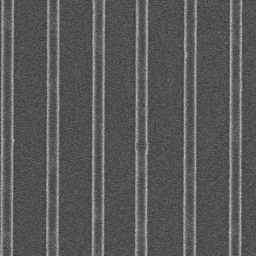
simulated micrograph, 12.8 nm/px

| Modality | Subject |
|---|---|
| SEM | parallel lines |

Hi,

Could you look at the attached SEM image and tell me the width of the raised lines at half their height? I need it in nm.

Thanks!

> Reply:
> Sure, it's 140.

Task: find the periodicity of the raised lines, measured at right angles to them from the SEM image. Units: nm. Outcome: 586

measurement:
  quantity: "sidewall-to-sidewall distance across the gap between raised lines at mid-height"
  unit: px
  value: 34.2